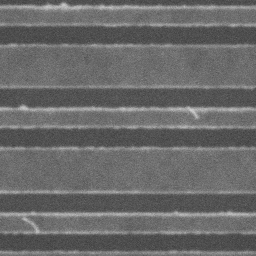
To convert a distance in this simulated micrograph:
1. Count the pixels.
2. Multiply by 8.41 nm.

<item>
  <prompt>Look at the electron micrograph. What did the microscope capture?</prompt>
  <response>lines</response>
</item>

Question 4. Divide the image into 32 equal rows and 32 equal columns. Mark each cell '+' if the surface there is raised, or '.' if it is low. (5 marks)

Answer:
................................
++++++++++++++++++++++++++++++++
++++++++++++++++++++++++++++++++
................................
................................
................................
++++++++++++++++++++++++++++++++
++++++++++++++++++++++++++++++++
++++++++++++++++++++++++++++++++
++++++++++++++++++++++++++++++++
++++++++++++++++++++++++++++++++
................................
................................
+.++......+....+.+++...+.......+
++++++++++++++++++++++++++++++++
++++++++++++++++++++++++++++++++
................................
................................
+++.+.+++++++.++++++.++++..+++++
++++++++++++++++++++++++++++++++
++++++++++++++++++++++++++++++++
++++++++++++++++++++++++++++++++
++++++++++++++++++++++++++++++++
++++++++++++++++++++++++++++++++
................................
................................
................................
++++++++++++++++++++++++++++++++
++++++++++++++++++++++++++++++++
................................
................................
++++..++++....+.+....++++.....++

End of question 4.